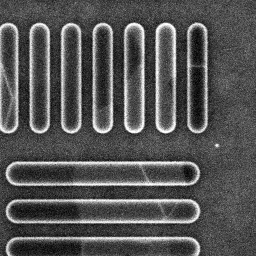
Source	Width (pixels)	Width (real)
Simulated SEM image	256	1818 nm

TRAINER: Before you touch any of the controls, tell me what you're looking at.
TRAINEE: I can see groups of lines, slits or small figures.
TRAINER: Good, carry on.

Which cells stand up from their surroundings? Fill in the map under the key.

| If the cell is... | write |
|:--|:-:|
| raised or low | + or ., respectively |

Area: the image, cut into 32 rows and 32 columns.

................................
................................
................................
++..++..++..++..++..++..++......
++..++..++..++..++..++..++......
++..++..++..++..++..++..++......
++..++..++..++..++..++..++......
++..++..++..++..++..++..++......
++..++..++..++..++..++..++......
++..++..++..++..++..++..++......
++..++..++..++..++..++..++......
++..++..++..++..++..++..++......
++..++..++..++..++..++..++......
++..++..++..++..++..++..++......
++..++..++..++..++..++..++......
++..++..++..++..++..++..++......
............+...+...+...+.......
................................
................................
................................
..++++++++++++++++++++++........
.++++++++++++++++++++++++.......
.++++++++++++++++++++++++.......
................................
................................
.++++++++++++++++++++++++.......
.++++++++++++++++++++++++.......
.+++++++++++++++++++++++........
................................
................................
.++++++++++++++++++++++++.......
.++++++++++++++++++++++++.......